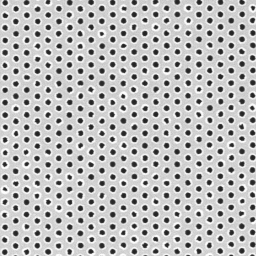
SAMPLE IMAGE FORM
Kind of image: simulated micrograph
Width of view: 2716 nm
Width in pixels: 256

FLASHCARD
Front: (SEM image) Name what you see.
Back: a regular array of holes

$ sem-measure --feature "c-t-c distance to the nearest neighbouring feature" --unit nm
129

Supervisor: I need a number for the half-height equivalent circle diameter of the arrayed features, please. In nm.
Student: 59.9